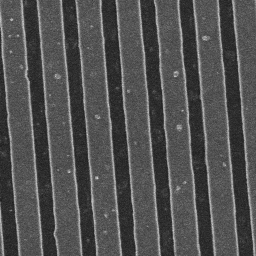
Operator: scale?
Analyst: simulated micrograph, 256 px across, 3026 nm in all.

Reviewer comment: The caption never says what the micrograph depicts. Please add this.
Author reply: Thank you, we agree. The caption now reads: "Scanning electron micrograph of parallel lines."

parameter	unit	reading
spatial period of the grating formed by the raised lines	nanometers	460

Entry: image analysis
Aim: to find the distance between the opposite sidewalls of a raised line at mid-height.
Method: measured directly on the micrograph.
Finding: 0.287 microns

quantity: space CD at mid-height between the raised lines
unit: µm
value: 0.172